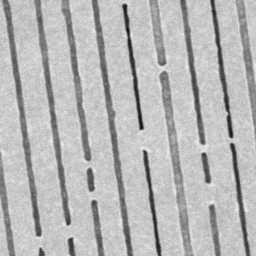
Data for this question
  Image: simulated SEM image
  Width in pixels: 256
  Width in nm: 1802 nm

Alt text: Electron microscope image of parallel lines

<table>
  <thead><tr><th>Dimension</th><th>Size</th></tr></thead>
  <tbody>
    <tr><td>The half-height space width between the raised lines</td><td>6.69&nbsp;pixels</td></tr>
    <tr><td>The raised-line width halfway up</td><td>22.6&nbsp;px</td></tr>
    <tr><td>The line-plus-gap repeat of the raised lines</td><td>204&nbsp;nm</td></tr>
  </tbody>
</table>